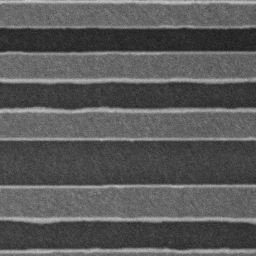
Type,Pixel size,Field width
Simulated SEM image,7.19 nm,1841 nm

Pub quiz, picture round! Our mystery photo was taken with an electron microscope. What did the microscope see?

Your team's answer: lines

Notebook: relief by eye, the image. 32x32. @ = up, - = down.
@@@@@@@@@@@@@@@@@@@@@@@@@@@@@@@@
@@@@@@@@@@@@@@@@@@@@@@@@@@@@@@@@
@@@@@@@@@@@@@@@@@@@@@@@@@@@@@@@@
-----@----------------------@---
--------------------------------
--------------------------------
--------------------------------
@@@@@@@@@@@@@@@@@@@@@@@@@@@@@@@@
@@@@@@@@@@@@@@@@@@@@@@@@@@@@@@@@
@@@@@@@@@@@@@@@@@@@@@@@@@@@@@@@@
--------------------------------
--------------------------------
--------------------------------
--------------------------------
@@@@@@@@@@@@@@@@@@@@@@@@@@@@@@@@
@@@@@@@@@@@@@@@@@@@@@@@@@@@@@@@@
@@@@@@@@@@@@@@@@@@@@@@@@@@@@@@@@
--------------------------------
--------------------------------
--------------------------------
--------------------------------
--------------------------------
--------------------------------
@@@@@@@@@@@@@@@@@@@@@@@@@@@@@@@@
@@@@@@@@@@@@@@@@@@@@@@@@@@@@@@@@
@@@@@@@@@@@@@@@@@@@@@@@@@@@@@@@@
@@@@@@@@@@@@@@@@@@@@@@@@@@@@@@@@
---@@@@-----------------------@@
--------------------------------
--------------------------------
--------------------------------
@@@@@@@@@@@@@@@@@@@@@@@@@@@@@@@@